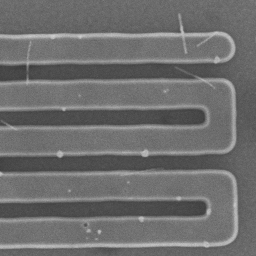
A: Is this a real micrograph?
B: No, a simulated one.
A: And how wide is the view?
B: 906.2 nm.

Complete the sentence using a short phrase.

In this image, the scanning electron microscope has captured groups of lines, slits or small figures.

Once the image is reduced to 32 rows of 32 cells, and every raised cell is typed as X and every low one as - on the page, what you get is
--------------------------------
--------------------------------
--------------------------------
--------------------------------
X--XXXXXXXXXXXXXXXXXXXXXXXXX----
XXXXXXXXXXXXXXXXXXXXXXXXXXXXX---
XXXXXXXXXXXXXXXXXXXXXXXXXXXXX---
XXXXXXXXXXXXXXXXXXXXXXXXXXXX----
--------------------------------
--------------------------------
XXXXXXXXXXXXXXXXXXXXXXXXXXXXX---
XXXXXXXXXXXXXXXXXXXXXXXXXXXXX---
XXXXXXXXXXXXXXXXXXXXXXXXXXXXX---
XXXXXXXXXXXXXXXX-XXX-----XXXX---
--------------------------XXX---
-------------------------XXXX---
XXXXXXXXXXXXXXXXXXXXXXXXXXXXX---
XXXXXXXXXXXXXXXXXXXXXXXXXXXXX---
XXXXXXXXXXXXXXXXXXXXXXXXXXXXX---
-------X------------------------
--------------------------------
-------------XXXXXXXXXXXXXXX----
XXXXXXXXXXXXXXXXXXXXXXXXXXXXX---
XXXXXXXXXXXXXXXXXXXXXXXXXXXXX---
XXXXXXXXXXXXXXXXXXXXXXXXXXXXX---
--------------------------XXX---
--------------------------XXXX--
XXXXXXXXXXXXXXXXXXXXXXXXXXXXXX--
XXXXXXXXXXXXXXXXXXXXXXXXXXXXXX--
XXXXXXXXXXXXXXXXXXXXXXXXXXXXX---
XXXXXXXXXXXXXXXXXXXXXXXXXXXX----
--------------------------------